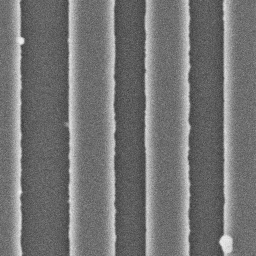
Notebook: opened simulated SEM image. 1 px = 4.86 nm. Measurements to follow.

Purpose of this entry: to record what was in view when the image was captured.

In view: lines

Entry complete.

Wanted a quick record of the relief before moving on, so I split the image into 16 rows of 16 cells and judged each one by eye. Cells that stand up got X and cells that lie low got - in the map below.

X---XXX--XXX--XX
X---XXX--XXX--XX
X---XXX--XXX--XX
X---XXX--XXX--XX
X---XXX--XXX--XX
X---XXX--XXX--XX
X---XXX--XXX--XX
X---XXX--XXX--XX
X---XXX--XXX--XX
X---XXX--XXX--XX
X---XXX--XXX--XX
X---XXX--XXX--XX
X---XXX--XXX--XX
X---XXX--XXX--XX
X---XXX--XXX--XX
X---XXX--XXX--XX